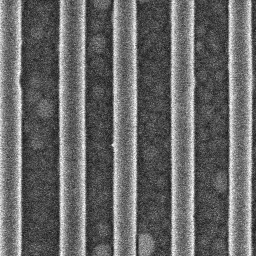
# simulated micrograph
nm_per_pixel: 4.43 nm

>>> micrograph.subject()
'parallel lines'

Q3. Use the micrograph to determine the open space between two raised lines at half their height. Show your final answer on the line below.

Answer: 159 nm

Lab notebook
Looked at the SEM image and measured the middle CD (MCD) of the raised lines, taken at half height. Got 0.0947 µm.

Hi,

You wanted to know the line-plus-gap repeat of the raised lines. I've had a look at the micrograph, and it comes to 248 nm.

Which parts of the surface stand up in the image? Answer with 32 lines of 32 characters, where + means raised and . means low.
+++.....+++...+++.....++.....++.
+++.....+++...+++.....++.....++.
+++.....+++...+++.....++.....++.
+++.....+++...+++....+++.....++.
+++....++++...+++....+++.....++.
+++....++++...+++....+++.....++.
+++....++++...+++....+++.....++.
+++....++++...+++....+++.....++.
+++....+++....+++....+++.....++.
++.....+++....+++....+++.....++.
++.....+++....+++....+++.....++.
+++....+++....+++....+++.....++.
+++....+++....+++....+++.....++.
+++....+++....+++....+++.....++.
+++....+++....+++....+++.....++.
+++....++++...+++.....++.....++.
+++....++++...+++.....++.....++.
+++.....+++...+++....+++.....++.
+++.....+++...+++....+++.....++.
+++.....+++...+++.....++.....++.
+++.....+++...+++.....++.....++.
+++.....+++...+++.....++.....++.
+++.....+++...+++.....++.....++.
+++.....+++...+++.....++.....++.
+++.....+++...+++.....++.....++.
+++.....+++...+++.....++.....++.
+++.....+++...+++.....++.....++.
+++.....+++...+++.....++.....++.
+++.....+++...+++.....++.....++.
+++.....+++...+++.....++.....++.
+++.....+++...++++....++.....++.
+++.....+++...+++.....++.....++.